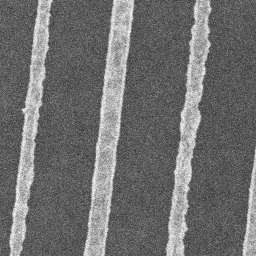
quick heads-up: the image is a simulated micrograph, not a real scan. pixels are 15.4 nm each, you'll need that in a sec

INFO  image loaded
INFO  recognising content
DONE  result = one or a few lines or trenches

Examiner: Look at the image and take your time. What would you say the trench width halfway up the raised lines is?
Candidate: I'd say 980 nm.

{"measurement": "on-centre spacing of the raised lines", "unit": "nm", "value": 1220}